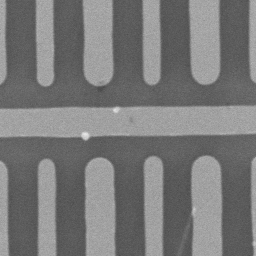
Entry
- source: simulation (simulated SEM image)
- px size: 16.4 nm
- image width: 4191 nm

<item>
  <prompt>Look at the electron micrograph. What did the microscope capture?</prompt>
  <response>groups of lines, slits or small figures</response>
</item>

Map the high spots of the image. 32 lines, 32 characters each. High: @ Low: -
@----@@---@@@@----@@----@@@----@
@----@@----@@@----@@----@@@----@
@----@@----@@@----@@----@@@----@
@----@@----@@@----@@----@@@----@
@----@@----@@@----@@----@@@----@
@----@@----@@@----@@----@@@----@
@----@@----@@@----@@----@@@----@
@----@@----@@@----@@----@@@----@
@----@@----@@@----@@----@@@----@
@----@@----@@@----@@----@@@----@
-----@------@------------@------
--------------------------------
--------------------------------
--------@@----@@@@@@@@@@@@@@@@@@
@@@@@@@@@@@@@@@@@@@@@@@@@@@@@@@@
@@@@@@@@@@@@@@@@@@@@@@@@@@@@@@@@
@@@@@@@@@@@@@@@@@@@@@@@@@@@@@@@@
--------------------------------
--------------------------------
--------------------------------
-----@@----@@@----@@----@@@-----
@----@@----@@@----@@----@@@@----
@----@@----@@@----@@----@@@@----
@----@@----@@@----@@----@@@@---@
@----@@----@@@----@@----@@@@---@
@----@@----@@@----@@----@@@@----
@----@@----@@@----@@----@@@@----
@----@@----@@@----@@----@@@@----
@----@@----@@@----@@----@@@@----
@----@@----@@@----@@----@@@@----
@----@@----@@@----@@----@@@@----
@----@@----@@@----@@----@@@@----